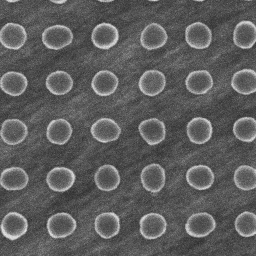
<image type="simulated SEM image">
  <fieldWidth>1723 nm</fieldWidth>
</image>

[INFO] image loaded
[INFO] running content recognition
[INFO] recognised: a regular array of raised bodies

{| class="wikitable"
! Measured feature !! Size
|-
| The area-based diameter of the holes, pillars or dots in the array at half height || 171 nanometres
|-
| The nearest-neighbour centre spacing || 0.308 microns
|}